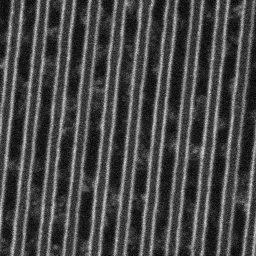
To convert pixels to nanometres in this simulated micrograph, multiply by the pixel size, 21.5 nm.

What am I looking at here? parallel lines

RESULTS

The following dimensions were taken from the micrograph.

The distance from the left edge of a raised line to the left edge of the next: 549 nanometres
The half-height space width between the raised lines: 0.19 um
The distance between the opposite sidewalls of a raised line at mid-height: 355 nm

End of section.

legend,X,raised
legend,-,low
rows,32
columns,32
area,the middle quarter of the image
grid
-XXXX--XXXX---XXXX--XXXX---XXXX-
-XXXX--XXXX--XXXXX--XXXX--XXXX--
-XXXX--XXXX--XXXX---XXXX--XXXX--
-XXXX--XXXX--XXXX---XXXX--XXXX--
XXXX---XXXX--XXXX---XXXX--XXXX--
XXXX---XXXX--XXXX--XXXXX--XXXX--
XXXX---XXXX--XXXX--XXXXX--XXXX--
XXXX--XXXX---XXXX--XXXX---XXXX--
XXXX--XXXX---XXXX--XXXX---XXXX--
XXXX--XXXX---XXXX--XXXX---XXXX--
XXXX--XXXX---XXXX--XXXX--XXXX---
XXXX--XXXX---XXXX--XXXX--XXXX---
XXXX--XXXX---XXXX--XXXX--XXXX---
XXX---XXXX--XXXX---XXXX--XXXX---
XXXX--XXXX--XXXX---XXXX--XXXX---
XXX---XXXX--XXXX--XXXXX--XXXX--X
XXX---XXXX--XXXX--XXXX---XXXX--X
XXX--XXXXX--XXXX--XXXX---XXXX--X
XXX--XXXXX--XXXX--XXXX---XXXX--X
XXX--XXXX---XXXX--XXXX---XXXX--X
XXX--XXXX---XXXX--XXXX--XXXX---X
XXX--XXXX---XXXX--XXXX--XXXX---X
XXX--XXXX--XXXXX--XXXX--XXXX---X
XX---XXXX--XXXX---XXXX--XXXX---X
XX---XXXX--XXXX---XXXX--XXXX---X
XX--XXXXX--XXXX--XXXXX--XXXX--XX
XX--XXXXX--XXXX--XXXX---XXXX--XX
XX--XXXX---XXXX--XXXX---XXXX--XX
XX--XXXX---XXXX--XXXX---XXXX--XX
XX--XXXX---XXXX--XXXX---XXX---XX
XX--XXXX---XXXX--XXXX--XXXX---XX
XX--XXXX---XXXX--XXXX--XXXX---XX